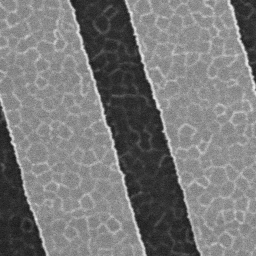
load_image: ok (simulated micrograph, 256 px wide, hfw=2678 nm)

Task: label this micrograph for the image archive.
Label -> one or a few lines or trenches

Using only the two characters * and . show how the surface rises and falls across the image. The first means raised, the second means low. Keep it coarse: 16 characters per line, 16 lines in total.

****....******..
*****...*******.
*****....******.
*****....******.
******...*******
******....******
******....******
*******...******
.******...******
.******....*****
.******....*****
.*******...*****
..******....****
..******....****
..*******...****
...******...****